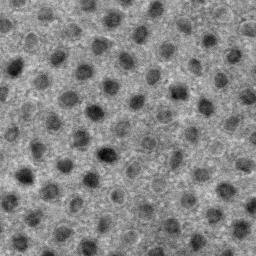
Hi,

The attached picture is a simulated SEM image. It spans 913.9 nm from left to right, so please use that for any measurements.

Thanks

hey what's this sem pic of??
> a regular array of raised bodies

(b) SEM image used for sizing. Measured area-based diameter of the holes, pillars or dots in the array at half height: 66.4 nanometres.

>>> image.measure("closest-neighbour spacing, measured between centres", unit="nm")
106